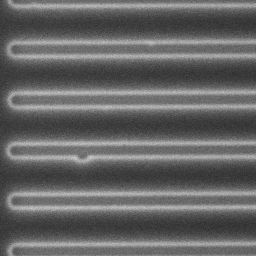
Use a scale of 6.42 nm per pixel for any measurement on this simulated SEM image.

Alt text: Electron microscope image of parallel lines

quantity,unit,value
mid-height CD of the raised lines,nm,242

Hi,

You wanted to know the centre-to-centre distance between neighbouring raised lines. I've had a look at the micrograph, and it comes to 324 nm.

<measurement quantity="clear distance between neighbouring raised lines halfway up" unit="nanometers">79.9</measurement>